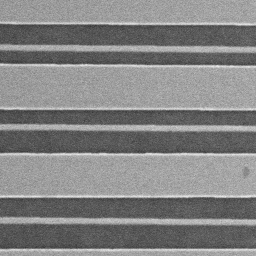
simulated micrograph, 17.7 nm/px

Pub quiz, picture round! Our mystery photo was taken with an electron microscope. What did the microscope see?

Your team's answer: lines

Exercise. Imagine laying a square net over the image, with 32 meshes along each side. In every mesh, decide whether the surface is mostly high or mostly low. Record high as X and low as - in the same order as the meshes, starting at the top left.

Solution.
XXXXXXXXXXXXXXXXXXXXXXXXXXXXXXXX
XXXXXXXXXXXXXXXXXXXXXXXXXXXXXXXX
XXXXXXXXXXXXXXXXXXXXXXXXXXXXXXXX
--------------------------------
--------------------------------
--------------------------------
--------------------------------
--------------------------------
XXXXXXXXXXXXXXXXXXXXXXXXXXXXXXXX
XXXXXXXXXXXXXXXXXXXXXXXXXXXXXXXX
XXXXXXXXXXXXXXXXXXXXXXXXXXXXXXXX
XXXXXXXXXXXXXXXXXXXXXXXXXXXXXXXX
XXXXXXXXXXXXXXXXXXXXXXXXXXXXXXXX
XXXXXXXXXXXXXXXXXXXXXXXXXXXXXXXX
--------------------------------
--------------------------------
--------------------------------
--------------------------------
--------------------------------
XXXXXXXXXXXXXXXXXXXXXXXXXXXXXXXX
XXXXXXXXXXXXXXXXXXXXXXXXXXXXXXXX
XXXXXXXXXXXXXXXXXXXXXXXXXXXXXXXX
XXXXXXXXXXXXXXXXXXXXXXXXXXXXXXXX
XXXXXXXXXXXXXXXXXXXXXXXXXXXXXXXX
XXXXXXXXXXXXXXXXXXXXXXXXXXXXXXXX
--------------------------------
--------------------------------
XXXXXXXXX------------X----------
--------------------------------
--------------------------------
--------------------------------
XXXXXXXXXXXXXXXXXXXXXXXXXXXXXXXX